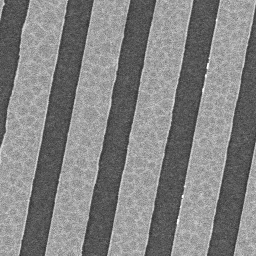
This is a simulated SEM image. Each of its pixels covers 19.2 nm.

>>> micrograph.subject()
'one or a few lines or trenches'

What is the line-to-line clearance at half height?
511 nanometres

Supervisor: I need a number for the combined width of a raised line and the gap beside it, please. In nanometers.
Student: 1190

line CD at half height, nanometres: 682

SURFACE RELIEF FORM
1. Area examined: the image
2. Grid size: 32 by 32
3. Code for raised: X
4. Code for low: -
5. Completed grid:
----XXXX----XXXX----XXXX----XXXX
---XXXXX----XXXX---XXXXX---XXXXX
---XXXXX---XXXXX---XXXXX---XXXXX
---XXXXX---XXXXX---XXXX----XXXX-
---XXXXX---XXXX----XXXX----XXXX-
---XXXX----XXXX---XXXXX----XXXX-
--XXXXX----XXXX---XXXXX---XXXXX-
--XXXXX---XXXXX---XXXXX---XXXXX-
--XXXXX---XXXXX---XXXXX---XXXX--
--XXXXX---XXXX----XXXX----XXXX--
--XXXX----XXXX----XXXX----XXXX--
--XXXX----XXXX---XXXXX---XXXXX--
-XXXXX---XXXXX---XXXXX---XXXXX--
-XXXXX---XXXXX---XXXXX---XXXX---
-XXXXX---XXXX----XXXX----XXXX---
-XXXX----XXXX----XXXX----XXXX---
-XXXX----XXXX---XXXXX---XXXXX---
-XXXX---XXXXX---XXXXX---XXXXX---
XXXXX---XXXXX---XXXXX---XXXX----
XXXXX---XXXX----XXXX----XXXX----
XXXXX---XXXX----XXXX----XXXX---X
XXXX----XXXX---XXXXX---XXXXX---X
XXXX---XXXXX---XXXXX---XXXXX---X
XXXX---XXXXX---XXXXX---XXXX----X
XXXX---XXXX----XXXX----XXXX----X
XXXX---XXXX----XXXX----XXXX---XX
XXX----XXXX----XXXX----XXXX---XX
XXX---XXXXX---XXXXX---XXXXX---XX
XXX---XXXXX---XXXXX---XXXXX---XX
XXX---XXXXX---XXXXX---XXXX----XX
XXX---XXXX----XXXX----XXXX----XX
XX----XXXX----XXXX----XXXX---XXX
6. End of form